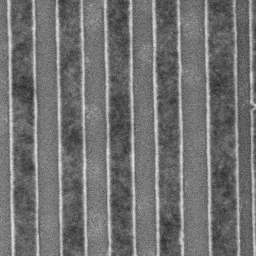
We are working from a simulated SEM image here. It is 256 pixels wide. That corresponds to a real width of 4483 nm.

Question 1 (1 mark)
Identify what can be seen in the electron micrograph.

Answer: parallel lines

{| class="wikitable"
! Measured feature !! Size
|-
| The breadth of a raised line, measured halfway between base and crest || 444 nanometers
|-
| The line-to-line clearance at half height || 396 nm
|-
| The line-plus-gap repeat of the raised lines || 871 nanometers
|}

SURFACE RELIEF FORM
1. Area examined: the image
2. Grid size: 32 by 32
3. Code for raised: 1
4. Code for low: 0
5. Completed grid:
01110001110001110001110000111001
01110001110001110001110000111001
01110001110001110001110000111001
01110001110001110001110000111001
01110001110001110001110000111001
01110001110001110001110000111101
01110001110001110001110000111101
01110001110001110001110000111001
01110001110001110001110000111001
01110001110001110001110000111001
01110001110001110001110000111001
01110001110001110001111000111101
01110001110001111001111000111101
01110001110001111001111000111100
01110001110001111001111000111101
01110001110000111000111000111000
01110001110000111000111000111100
01110001111000111000111000111100
01110001111000111000111000111100
01111001111001111000111000111100
00111000111001111000111000111100
00111000111000111000111000111100
00111000111000111000111000111100
01111000111000111000111000111100
01111000111000111000111000111100
01111000111000111000111000111100
01111000111000111000111000111100
00111000111000111000111000111100
00111000111000111000111000111100
00111000111000111000111000111100
00111000111000111000111000111100
00111000111000111000111000111100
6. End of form